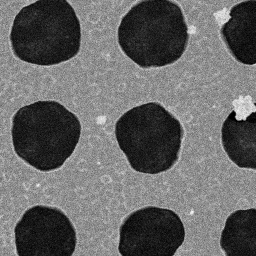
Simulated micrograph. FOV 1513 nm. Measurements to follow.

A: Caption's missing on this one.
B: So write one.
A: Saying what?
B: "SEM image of holes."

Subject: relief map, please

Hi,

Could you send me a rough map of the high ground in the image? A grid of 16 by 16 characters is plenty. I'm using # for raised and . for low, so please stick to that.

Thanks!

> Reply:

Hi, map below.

##...###...####.
#....###....##..
#....##.....##..
#....###...####.
################
################
##..#####.######
#....##....###..
#....##....###..
#....###...###..
##..####...####.
################
################
#...####...###..
#....##.....##..
#....##....###..